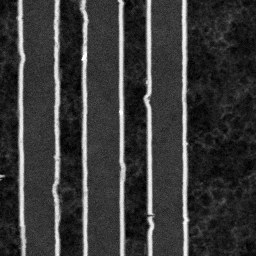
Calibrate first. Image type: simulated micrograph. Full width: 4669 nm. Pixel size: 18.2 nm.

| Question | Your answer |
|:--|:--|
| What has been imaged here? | one or a few lines or trenches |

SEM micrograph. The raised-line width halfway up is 652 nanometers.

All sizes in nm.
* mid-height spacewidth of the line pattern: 506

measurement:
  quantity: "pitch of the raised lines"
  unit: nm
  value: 1170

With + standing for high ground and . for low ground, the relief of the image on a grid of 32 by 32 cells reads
...++++...+++++....++++.........
...++++...+++++....++++.........
...++++....++++....++++.........
...++++....++++....++++.........
...++++....++++....++++.........
...++++....++++....++++.........
...++++....++++....++++.........
...++++...+++++....++++.........
...++++....++++....++++.........
...++++....++++....++++.........
...++++....++++....++++.........
...++++....++++....++++.........
...++++....++++...+++++.........
...++++....++++....++++.........
...++++....++++....++++.........
...++++....++++....++++.........
...++++....++++....++++.........
...++++....++++....++++.........
...++++....++++....++++.........
...++++....++++....++++.........
...++++....++++....++++.........
...++++....++++....++++.........
...++++....++++....++++.........
...++++....++++....++++.........
...++++....++++....++++.........
...++++....++++....++++.........
...++++....++++....++++.........
...++++....++++....++++.........
...++++....++++....++++.........
...++++....++++....++++.........
...++++....++++....++++.........
...++++....++++....++++.........